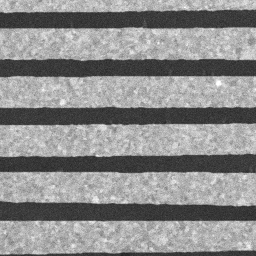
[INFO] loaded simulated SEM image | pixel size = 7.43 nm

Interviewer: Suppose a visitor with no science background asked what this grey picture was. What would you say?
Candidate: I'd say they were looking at lines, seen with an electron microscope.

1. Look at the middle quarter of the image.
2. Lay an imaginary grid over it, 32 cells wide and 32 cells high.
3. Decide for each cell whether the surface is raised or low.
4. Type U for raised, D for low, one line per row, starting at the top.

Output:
DDDDDDDDDDDDDDDDDDDDDDDDDDDDDDDD
DDDDDDDDDDDDDDDDDDDDDDDDDDDDDDDD
DDDDDDDDDDDDDDDDDDDDDDDDDDDDDDDD
UUUUUUUUUUUUUUUUUUUUUUUUUUUUUUUU
UUUUUUUUUUUUUUUUUUUUUUUUUUUUUUUU
UUUUUUUUUUUUUUUUUUUUUUUUUUUUUUUU
UUUUUUUUUUUUUUUUUUUUUUUUUUUUUUUU
UUUUUUUUUUUUUUUUUUUUUUUUUUUUUUUU
UUUUUUUUUUUUUUUUUUUUUUUUUUUUUUUU
UUUUUUUUUUUUUUUUUUUUUUUUUUUUUUUU
UUUUUUUUUUUUUUUUUUUUUUUUUUUUUUUU
DDDDDDDDDDDDDDDDDDDDDDDDDDDDDDDD
DDDDDDDDDDDDDDDDDDDDDDDDDDDDDDDD
DDDDDDDDDDDDDDDDDDDDDDDDDDDDDDDD
DDDDDDDDDDDDDDDDDDDDDDDDDDDDDDDD
UUUUUUUUUUUUUUUUUUUUUUUUUUUUUUUU
UUUUUUUUUUUUUUUUUUUUUUUUUUUUUUUU
UUUUUUUUUUUUUUUUUUUUUUUUUUUUUUUU
UUUUUUUUUUUUUUUUUUUUUUUUUUUUUUUU
UUUUUUUUUUUUUUUUUUUUUUUUUUUUUUUU
UUUUUUUUUUUUUUUUUUUUUUUUUUUUUUUU
UUUUUUUUUUUUUUUUUUUUUUUUUUUUUUUU
UUUUUUUUUUUUUUUUUUUUUUUUUUUUUUUU
DDDDDDDDDDDDDDDDDDDDDDDDDDDDDDDD
DDDDDDDDDDDDDDDDDDDDDDDDDDDDDDDD
DDDDDDDDDDDDDDDDDDDDDDDDDDDDDDDD
DDDDDDDDDDDDDDDDDDDDDDDDDDDDDDDD
UUUUUUUUUUUUUUUUUUUUUUUUUUUUUUUU
UUUUUUUUUUUUUUUUUUUUUUUUUUUUUUUU
UUUUUUUUUUUUUUUUUUUUUUUUUUUUUUUU
UUUUUUUUUUUUUUUUUUUUUUUUUUUUUUUU
UUUUUUUUUUUUUUUUUUUUUUUUUUUUUUUU